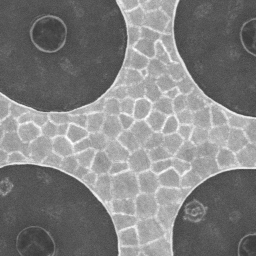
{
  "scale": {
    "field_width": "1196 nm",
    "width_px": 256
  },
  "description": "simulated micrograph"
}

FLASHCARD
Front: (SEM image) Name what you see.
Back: ring-shaped grooves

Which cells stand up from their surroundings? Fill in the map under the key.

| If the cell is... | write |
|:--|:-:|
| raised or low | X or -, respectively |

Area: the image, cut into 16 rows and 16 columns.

-------XXXX-----
--XX----XXX----X
--XX----XXX----X
--------XXX-----
-------XXXXX----
-------XXXXX----
X-----XXXXXXXX--
XXXXXXXXXXXXXXXX
XXXXXXXXXXXXXXXX
XXXXXXXXXXXXXXXX
---XXXXXXXXXXXX-
-----XXXXXXX----
------XXXXXX----
-------XXXX-----
-XX----XXXX-----
-XX----XXXX----X